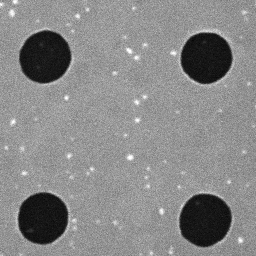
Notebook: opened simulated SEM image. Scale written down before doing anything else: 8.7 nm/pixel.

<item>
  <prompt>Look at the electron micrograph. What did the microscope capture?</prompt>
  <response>holes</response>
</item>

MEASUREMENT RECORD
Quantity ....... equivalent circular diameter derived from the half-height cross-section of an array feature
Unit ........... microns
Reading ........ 0.458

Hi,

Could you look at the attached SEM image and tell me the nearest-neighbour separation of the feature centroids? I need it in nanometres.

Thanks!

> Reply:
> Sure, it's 1400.